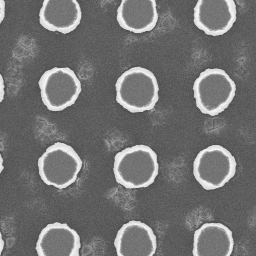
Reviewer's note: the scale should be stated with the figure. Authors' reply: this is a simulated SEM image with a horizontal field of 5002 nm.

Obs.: raised bodies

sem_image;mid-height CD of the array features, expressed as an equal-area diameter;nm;775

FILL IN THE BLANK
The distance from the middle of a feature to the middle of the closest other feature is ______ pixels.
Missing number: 76.8